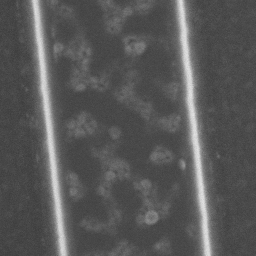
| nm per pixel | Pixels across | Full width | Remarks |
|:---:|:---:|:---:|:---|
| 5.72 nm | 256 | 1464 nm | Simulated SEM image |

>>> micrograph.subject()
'one or a few lines or trenches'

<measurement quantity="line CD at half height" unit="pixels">145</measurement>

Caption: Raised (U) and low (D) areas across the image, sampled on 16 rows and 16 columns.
DDUUUUUUUUUDDDDD
DDUUUUUUUUUDDDDD
DDUUUUUUUUUUDDDD
DDDUUUUUUUUUDDDD
DDDUUUUUUUUUDDDD
DDDUUUUUUUUUDDDD
DDDUUUUUUUUUDDDD
DDDUUUUUUUUUDDDD
DDDUUUUUUUUUDDDD
DDDUUUUUUUUUDDDD
DDDUUUUUUUUUDDDD
DDDUUUUUUUUUUDDD
DDDDUUUUUUUUUDDD
DDDDUUUUUUUUUDDD
DDDDUUUUUUUUUDDD
DDDDUUUUUUUUUDDD